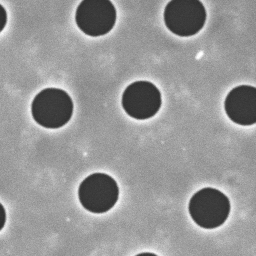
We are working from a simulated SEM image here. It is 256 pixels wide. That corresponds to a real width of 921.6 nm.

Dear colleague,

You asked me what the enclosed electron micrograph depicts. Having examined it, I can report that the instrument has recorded holes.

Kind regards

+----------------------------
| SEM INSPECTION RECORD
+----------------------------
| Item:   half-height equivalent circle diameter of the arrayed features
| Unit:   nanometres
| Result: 149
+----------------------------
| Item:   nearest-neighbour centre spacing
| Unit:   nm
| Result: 335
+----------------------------